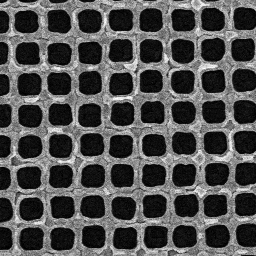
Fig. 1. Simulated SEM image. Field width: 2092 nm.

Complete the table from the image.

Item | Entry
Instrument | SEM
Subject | a regular array of holes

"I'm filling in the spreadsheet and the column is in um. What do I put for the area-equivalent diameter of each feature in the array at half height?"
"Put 0.204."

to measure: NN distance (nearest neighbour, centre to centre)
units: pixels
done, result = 30.1